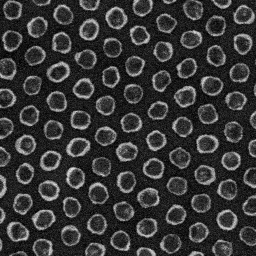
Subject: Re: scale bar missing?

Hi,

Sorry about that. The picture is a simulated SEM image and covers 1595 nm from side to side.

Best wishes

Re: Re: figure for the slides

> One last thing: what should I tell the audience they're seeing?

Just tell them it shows a regular array of raised bodies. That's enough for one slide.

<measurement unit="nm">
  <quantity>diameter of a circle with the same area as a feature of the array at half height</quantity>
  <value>116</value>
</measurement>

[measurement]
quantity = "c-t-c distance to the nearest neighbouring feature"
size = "175 nm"